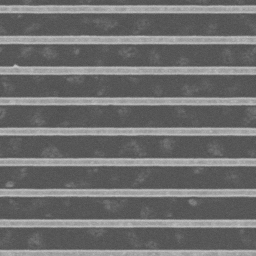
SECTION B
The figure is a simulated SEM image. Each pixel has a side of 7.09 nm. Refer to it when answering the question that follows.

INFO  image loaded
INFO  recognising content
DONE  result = parallel lines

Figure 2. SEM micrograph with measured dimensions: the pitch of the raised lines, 217 nm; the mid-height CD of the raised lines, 50.5 nm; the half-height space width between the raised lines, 164 nm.